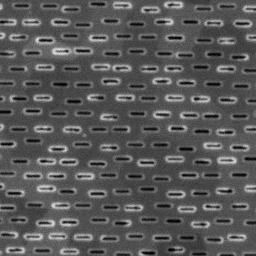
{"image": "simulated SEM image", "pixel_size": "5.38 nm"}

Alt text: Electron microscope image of a regular array of holes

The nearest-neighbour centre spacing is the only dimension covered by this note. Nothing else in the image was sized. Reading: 95.1 nm